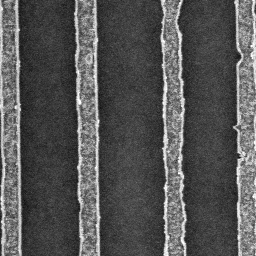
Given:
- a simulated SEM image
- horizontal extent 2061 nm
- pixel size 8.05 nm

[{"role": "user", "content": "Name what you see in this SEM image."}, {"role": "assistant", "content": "one or a few lines or trenches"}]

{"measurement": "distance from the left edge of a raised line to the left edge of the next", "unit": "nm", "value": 653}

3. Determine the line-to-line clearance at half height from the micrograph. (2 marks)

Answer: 480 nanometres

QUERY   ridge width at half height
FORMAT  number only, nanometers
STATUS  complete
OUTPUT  142